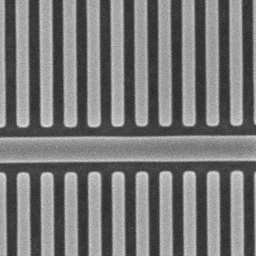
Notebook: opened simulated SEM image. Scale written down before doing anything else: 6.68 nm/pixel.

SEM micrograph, groups of lines, slits or small figures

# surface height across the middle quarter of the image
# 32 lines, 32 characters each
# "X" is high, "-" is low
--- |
XXX---XXX---XXX---XXX---XXX---XX
XXX---XXX---XXX---XXX---XXX---XX
XXX---XXX---XXX---XXX---XXX---XX
XXX---XXX---XXX---XXX---XXX---XX
XXX---XXX---XXX---XXX---XXX---XX
XXX---XXX---XXX---XXX---XXX---XX
XXX---XXX---XXX---XXX---XXX---XX
XXX---XXX---XXX---XXX---XXX---XX
XXX---XXX---XXX---XXX---XXX---XX
XXX---XXX---XXX---XXX---XXX---XX
XXX---XXX---XXX---XXX---XXX---XX
XXX---XXX---XXX---XXX---XXX---XX
XXX---XXX---XXX---XXX---XXX---XX
XXX---XXX---XXX---XXX---XXX---XX
XXX---XXX---XXX---XXX---XXX---XX
-X-----X------------------------
--------------------------------
--------------------------------
---XXXXXXXXXX------XXXXXXXXXXXXX
XXXXXXXXXXXXXXXXXXXXXXXXXXXXXXXX
XXXXXXXXXXXXXXXXXXXXXXXXXXXXXXXX
XXXXXXXXXXXXXXXXXXXXXXXXXXXXXXXX
XXXXXXXXXXXXXXXXXXXXXXXXXXXXXXXX
XXXXXXXXXXXXXXXXXXXXXXXXXXXXXXXX
--------------------------------
--------------------------------
--------------------------------
-XX----XX---XXX---XXX---XXX---XX
XXX---XXX---XXX---XXX---XXX---XX
XXX---XXX---XXX---XXX---XXX---XX
XXX---XXX---XXX---XXX---XXX---XX
XXX---XXX---XXX---XXX---XXX---XX